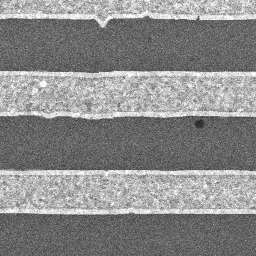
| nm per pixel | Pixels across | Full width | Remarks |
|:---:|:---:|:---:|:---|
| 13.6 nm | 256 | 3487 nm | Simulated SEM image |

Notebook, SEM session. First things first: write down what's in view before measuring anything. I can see one or a few lines or trenches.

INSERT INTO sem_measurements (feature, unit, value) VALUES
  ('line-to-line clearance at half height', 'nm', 778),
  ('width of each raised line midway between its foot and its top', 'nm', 553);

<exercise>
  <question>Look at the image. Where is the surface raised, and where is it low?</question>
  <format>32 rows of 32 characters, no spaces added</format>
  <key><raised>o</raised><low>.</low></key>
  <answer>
oooooooooooooooooooooooooooooooo
oooooooooooooooooooooooooooooooo
............o...................
................................
................................
................................
................................
................................
................................
ooooooooooo.oooooooooooooooooooo
oooooooooooooooooooooooooooooooo
oooooooooooooooooooooooooooooooo
oooooooooooooooooooooooooooooooo
oooooooooooooooooooooooooooooooo
..........oooo..................
................................
................................
................................
................................
................................
................................
................................
oooooooooooooooooooooooooooooooo
oooooooooooooooooooooooooooooooo
oooooooooooooooooooooooooooooooo
oooooooooooooooooooooooooooooooo
........oooo....................
................................
................................
................................
................................
................................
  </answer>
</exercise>